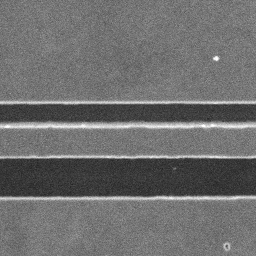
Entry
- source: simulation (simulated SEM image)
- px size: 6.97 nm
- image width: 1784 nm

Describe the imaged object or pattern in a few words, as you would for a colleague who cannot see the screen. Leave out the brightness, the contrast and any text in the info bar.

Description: lines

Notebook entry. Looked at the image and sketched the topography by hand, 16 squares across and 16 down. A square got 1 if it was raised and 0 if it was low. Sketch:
1111111111111111
1111111111111111
1111111111111111
1111111111111111
1111111111111111
1111111111111111
0000000000000000
0000000000000000
1111111111111111
1111111111111111
0000000000000000
0000000000000000
1111111111111111
1111111111111111
1111111111111111
1111111111111111